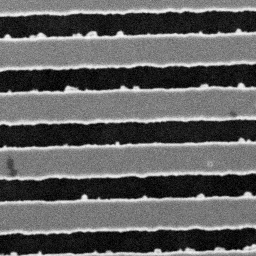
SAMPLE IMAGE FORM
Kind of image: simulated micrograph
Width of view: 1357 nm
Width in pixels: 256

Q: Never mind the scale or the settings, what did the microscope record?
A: lines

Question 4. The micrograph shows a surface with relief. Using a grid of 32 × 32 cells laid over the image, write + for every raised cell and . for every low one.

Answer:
++++++++++++++++++++++++++++++++
+++++++++++++++++++++...+.......
................................
................................
...............+++++++++++++++++
++++++++++++++++++++++++++++++++
++++++++++++++++++++++++++++++++
++++++++++++++++++++++++++++++++
++++++++++.+....................
................................
................................
...+++++++++++++++++++++++++++++
++++++++++++++++++++++++++++++++
++++++++++++++++++++++++++++++++
++++++++++++++++++++++++++++++++
+++.............................
................................
................................
.+++++++++++++++++++++++++++++++
++++++++++++++++++++++++++++++++
++++++++++++++++++++++++++++++++
++++++++++++++++++++++++++++++++
................................
................................
................................
++++++++++++++++++++++++++++++++
++++++++++++++++++++++++++++++++
++++++++++++++++++++++++++++++++
+++++++++++++++++++++++++++++++.
................................
................................
.....................+++++++++++